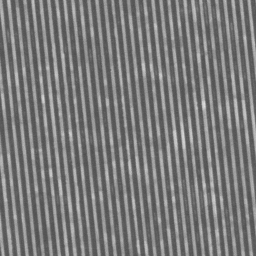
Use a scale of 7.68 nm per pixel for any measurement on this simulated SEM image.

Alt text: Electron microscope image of parallel lines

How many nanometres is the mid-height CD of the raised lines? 21.9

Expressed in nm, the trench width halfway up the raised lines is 39.1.